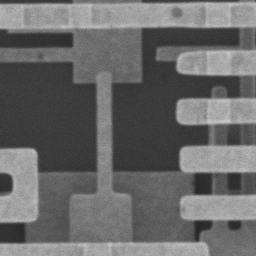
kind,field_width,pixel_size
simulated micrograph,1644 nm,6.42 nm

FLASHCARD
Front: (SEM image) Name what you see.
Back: wiring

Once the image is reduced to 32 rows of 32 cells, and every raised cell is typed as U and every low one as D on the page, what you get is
DDDDDDDDDDDDDDDUUUUUUUUUUUUUUUUU
UUUUUUUUUUUUUUUUUUUUUUUUUUUUUUUU
UUUUUUUUUUUUUUUUUUUUUUUUUUUUUUUU
UUUUUUUUUDUUUDDDDDDDDDDDDDDDDDDD
DDDDDDDDDDDDDDDDDDDDDDDDDDDDDDDD
DDDDDDDDDDDDDDDDDDDDDDDDDDDDDDDD
DDDDDDDDDDDDDDDDDDDDDDDDUUUUUUUU
DDDDDDDDDDDDDDDDDDDDDDUUUUUUUUUU
DDDDDDDDDDDDDDDDDDDDDDUUUUUUUUUU
DDDDDDDDDDDDDDDDDDDDDDDDDDDDDDDD
DDDDDDDDDDDDDDDDDDDDDDDDDDDDDDDD
DDDDDDDDDDDDDDDDDDDDDDDDDDDDDDDD
DDDDDDDDDDDDDDDDDDDDDDDUUUUUUUUU
DDDDDDDDDDDDDDDDDDDDDDUUUUUUUUUU
DDDDDDDDDDDDDDDDDDDDDDUUUUUUUUUU
DDDDDDDDDDDDDDDDDDDDDDDDDDDDDDDD
DDDDDDDDDDDDDDDDDDDDDDDDDDDDDDDD
DDDDDDDDDDDDDDDDDDDDDDDDDDDDDDDD
DDDDDDDDDDDDDDDDDDDDDDDUUUUUUUUU
UUUUUDDDDDDDDDDDDDDDDDUUUUUUUUUU
UUUUUDDDDDDDDDDDDDDDDDUUUUUUUUUU
UUUUUDDDDDDDDDDDDDDDDDDUUUUUUUUD
DDUUUDDDDDDDDDDDDDDDDDDDDDDDDDDD
DDUUUDDDDDDDDDDDDDDDDDDDDDDDDDDD
UUUUUDDDDDDDDDDDDDDDDDDUUUUUUUUU
UUUUUDDDDDDDDDDDDDDDDDDUUUUUUUUU
UUUUUDDDDDDDDDDDDDDDDDDUUUUUUUUU
UUUUDDDDDDDDDDDDDDDDDDDDDDDDDDDD
DDDDDDDDDDDDDDDDDDDDDDDDDDDDDDDD
DDDDDDDDDDDDDDDDDDDDDDDDDDDDDDDD
DDDDDUUUUUUUUUUUUUUUUUUUUUDDDDDD
UUUUUUUUUUUUUUUUUUUUUUUUUUDDDDDD